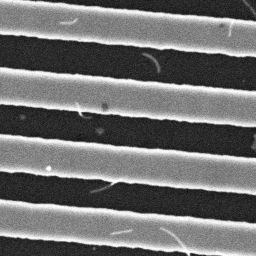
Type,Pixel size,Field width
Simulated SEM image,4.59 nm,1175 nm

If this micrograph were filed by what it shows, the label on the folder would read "lines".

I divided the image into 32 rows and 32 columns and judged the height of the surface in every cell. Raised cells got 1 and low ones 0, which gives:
11111111000000000000000000000000
11111111111111111100000000000000
11111111111111111111111111111100
11111111111111111111111111111111
00011111111111111111111111111111
00000000000000011111111111111111
00000000000000000000000001111111
00000000000000000000000000000000
00000000000000000000000000000000
11111111111100000000000000000000
11111111111111111111110000000000
11111111111111111111111111111111
11111111111111111111111111111111
00000011111111111111111111111111
00000000000000001111111111111111
00000000000000000000000000001111
00000000000000000000000000000000
11111111000000000000000000000000
11111111111111111100000000000000
11111111111111111111111111111000
11111111111111111111111111111111
01011111111111111111111111111111
00000000000001111111111111111111
00000000000000000000000111111111
00000000000000000000000000000000
11110000000000000000000000000000
11111111111111110000000000000000
11111111111111111111111111000000
11111111111111111111111111111111
11111111111111111111111111111111
00000000000111111111111111111111
00000000000000000000000111111111